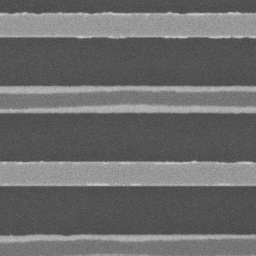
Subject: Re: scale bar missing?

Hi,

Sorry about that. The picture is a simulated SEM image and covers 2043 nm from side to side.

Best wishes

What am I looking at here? lines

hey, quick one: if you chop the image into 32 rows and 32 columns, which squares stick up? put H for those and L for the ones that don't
LLLLLLLLLLLLLLLLLLLLLLLLLLLLLLLL
LLLLLLLLLLLLLLLLLLLLLLLLLLLLLLLL
HHHHHHHHHHHHHHHHHHHHHHHHHHHHHHHH
HHHHHHHHHHHHHHHHHHHHHHHHHHHHHHHH
HHHHHHHHHHHHHHHHHHHHHHHHHHHHHHHH
LLLLLLLLLLLLLLLLLLLLLLLLLLLLLLLL
LLLLLLLLLLLLLLLLLLLLLLLLLLLLLLLL
LLLLLLLLLLLLLLLLLLLLLLLLLLLLLLLL
LLLLLLLLLLLLLLLLLLLLLLLLLLLLLLLL
LLLLLLLLLLLLLLLLLLLLLLLLLLLLLLLL
LLLLLLLLLLLLLLLLLLLLLLLLLLLLLLLL
HHHHHHHHHHHHHHHHHHHHHHHHHHHHHHHH
HHHHHHHHHHHHHHHHHHHHHHHHHHHHHHHH
HHHHHHHHHHHHHHHHHHHHHHHHHHHHHHHH
LLLLLLLLLLLLLLLLLLLLLLLLLLLLLLLL
LLLLLLLLLLLLLLLLLLLLLLLLLLLLLLLL
LLLLLLLLLLLLLLLLLLLLLLLLLLLLLLLL
LLLLLLLLLLLLLLLLLLLLLLLLLLLLLLLL
LLLLLLLLLLLLLLLLLLLLLLLLLLLLLLLL
LLLLLLLLLLLLLLLLLLLLLLLLLLLLLLLL
HHHHHHHHHHHHHHHHHHHHHHHHHHHHHHHH
HHHHHHHHHHHHHHHHHHHHHHHHHHHHHHHH
HHHHHHHHHHHHHHHHHHHHHHHHHHHHHHHH
LLLLLLLLLLLLLLLLLLLLLLLLLLLLLLLL
LLLLLLLLLLLLLLLLLLLLLLLLLLLLLLLL
LLLLLLLLLLLLLLLLLLLLLLLLLLLLLLLL
LLLLLLLLLLLLLLLLLLLLLLLLLLLLLLLL
LLLLLLLLLLLLLLLLLLLLLLLLLLLLLLLL
LLLLLLLLLLLLLLLLLLLLLLLLLLLLLLLL
LLLLLLLLLLLLLLLLLLLLLLLLLLLLLLLL
HHHHHHHHHHHHHHHHHHHHHHHHHHHHHHHH
HHHHHHHHHHHHHHHHHHHHHHHHHHHHHHHH